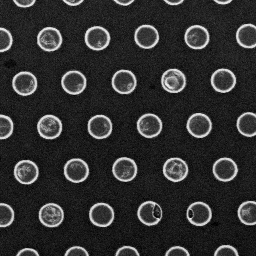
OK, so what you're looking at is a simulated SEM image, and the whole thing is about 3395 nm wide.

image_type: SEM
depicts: a regular array of raised bodies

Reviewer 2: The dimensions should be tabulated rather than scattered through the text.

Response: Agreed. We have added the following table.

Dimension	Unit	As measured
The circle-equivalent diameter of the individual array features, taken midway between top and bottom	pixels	22.9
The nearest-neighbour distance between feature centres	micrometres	0.655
